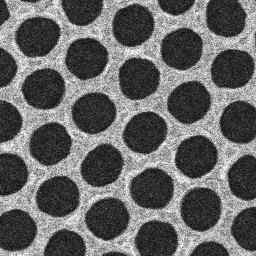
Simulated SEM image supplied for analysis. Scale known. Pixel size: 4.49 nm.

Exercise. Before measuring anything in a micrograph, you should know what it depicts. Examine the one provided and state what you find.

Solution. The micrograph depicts a regular array of holes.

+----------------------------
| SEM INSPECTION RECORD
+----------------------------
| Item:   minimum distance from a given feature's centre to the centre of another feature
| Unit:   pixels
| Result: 53.1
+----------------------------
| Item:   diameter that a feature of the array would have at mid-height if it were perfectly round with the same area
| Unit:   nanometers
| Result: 191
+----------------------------